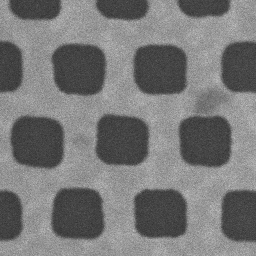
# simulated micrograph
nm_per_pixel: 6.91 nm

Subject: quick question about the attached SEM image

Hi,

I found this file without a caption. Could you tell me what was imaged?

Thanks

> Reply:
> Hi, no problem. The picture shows holes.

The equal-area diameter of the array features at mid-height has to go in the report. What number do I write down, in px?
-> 55.6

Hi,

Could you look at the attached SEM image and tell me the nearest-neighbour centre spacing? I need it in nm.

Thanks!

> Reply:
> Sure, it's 570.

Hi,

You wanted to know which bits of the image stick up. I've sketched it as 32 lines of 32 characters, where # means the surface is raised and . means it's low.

#.......####......####.......###
##.....#####......#####.....####
####..##########.###############
################################
################################
..######...########.#########...
...####......####......#####....
...###.......####......#####....
...####......####......#####....
...####......####......#####....
...####......####......#####....
.#######....######.....#######..
################################
################################
#############...########...#####
##......####......#####......###
#.......####.......###.......###
#.......####.......###.......###
#.......####.......###.......###
##......####......#####......###
###....######....#######....####
################################
################################
#########.######################
..#####......####......#####....
...####......####......#####....
...####......####......#####....
...###.......####......#####....
...####......####......#####....
..#####.....######.....#####....
################################
################################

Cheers